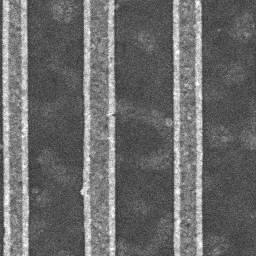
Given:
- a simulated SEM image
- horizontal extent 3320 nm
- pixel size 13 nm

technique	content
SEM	one or a few lines or trenches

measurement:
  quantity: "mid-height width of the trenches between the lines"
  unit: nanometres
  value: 828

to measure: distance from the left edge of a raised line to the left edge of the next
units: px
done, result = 86.2